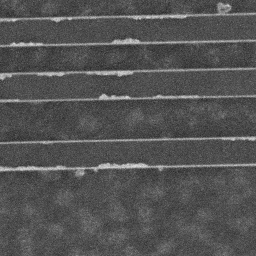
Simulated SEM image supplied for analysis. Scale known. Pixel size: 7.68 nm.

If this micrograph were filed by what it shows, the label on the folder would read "parallel lines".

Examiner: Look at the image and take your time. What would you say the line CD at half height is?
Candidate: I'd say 214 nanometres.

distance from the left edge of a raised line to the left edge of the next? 0.476 microns